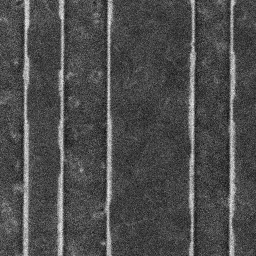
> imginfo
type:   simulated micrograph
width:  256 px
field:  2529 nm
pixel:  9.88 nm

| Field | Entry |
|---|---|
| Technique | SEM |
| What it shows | one or a few lines or trenches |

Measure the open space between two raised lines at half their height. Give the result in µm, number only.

0.427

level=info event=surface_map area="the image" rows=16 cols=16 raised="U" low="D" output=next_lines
DDUUDDDUUUUUDDDU
DDUUDDDUUUUUDDUU
DDUUDDDUUUUUDDUU
DDUUDDDUUUUUDDUU
DUUUDDDUUUUUDDUU
DDUUDDDUUUUUDDUU
DDUUDDDUUUUUDDUU
DDUUDDDUUUUUDDUU
DDUUDDDUUUUUDDUU
DDUUDDDUUUUUDDUU
DDUUDDDUUUUUDDUU
DDUUDDDUUUUUDDUU
DDUUDDDUUUUUDDUU
DDUUDDDUUUUUDDUU
DDUUDDDUUUUUDDUU
DUUUDDDUUUUUDDUU